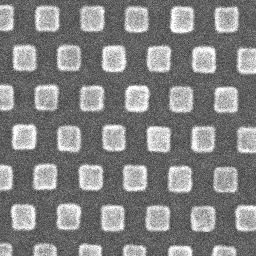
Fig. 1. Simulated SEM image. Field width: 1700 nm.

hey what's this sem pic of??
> a regular array of raised bodies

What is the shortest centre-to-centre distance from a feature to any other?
296 nm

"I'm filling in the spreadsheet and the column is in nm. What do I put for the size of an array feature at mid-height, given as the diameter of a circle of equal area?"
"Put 173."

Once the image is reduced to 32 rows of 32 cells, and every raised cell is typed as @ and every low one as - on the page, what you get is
--------------------------------
@@---@@---@@@---@@---@@@---@@@--
@@---@@---@@@---@@---@@@---@@@--
@----@@---@@@---@@---@@@---@@@--
--------------------------------
--------------------------------
--@@---@@@---@@@---@@---@@@---@@
--@@---@@@---@@@--@@@---@@@---@@
--@@---@@@---@@----@@---@@@---@@
--------------------------------
--------------------------------
@@---@@---@@@---@@@--@@@---@@@--
@@---@@---@@@---@@@--@@@---@@@--
@----@@---@@@---@@---@@@---@@@--
--------------------------------
--------------------------------
--@@---@@@---@@@--@@@---@@@---@@
--@@---@@@---@@@--@@@---@@@---@@
--@@---@@@---@@----@@---@@@---@@
--------------------------------
--------------------------------
@---@@@---@@@---@@---@@@---@@@--
@---@@@---@@@---@@---@@@---@@@--
@----@@---@@----@@---@@@---@@@--
--------------------------------
--------------------------------
--@@---@@@---@@@--@@@---@@@---@@
--@@---@@@---@@@--@@@---@@@---@@
--@@----@----@@---@@@---@@@---@@
--------------------------------
--------------------------------
@---@@@---@@@--@@@---@@@---@@---